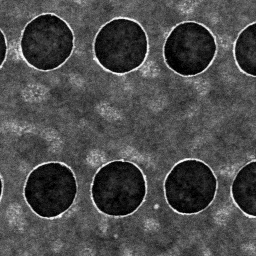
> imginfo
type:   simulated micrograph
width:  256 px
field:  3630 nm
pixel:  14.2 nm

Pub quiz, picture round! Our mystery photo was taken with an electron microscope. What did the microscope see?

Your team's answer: holes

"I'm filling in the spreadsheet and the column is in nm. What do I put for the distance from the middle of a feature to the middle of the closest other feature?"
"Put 972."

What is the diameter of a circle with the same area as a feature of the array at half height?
53.6 pixels